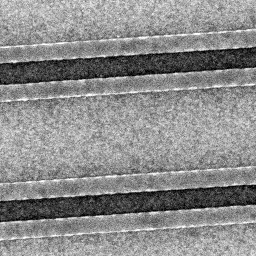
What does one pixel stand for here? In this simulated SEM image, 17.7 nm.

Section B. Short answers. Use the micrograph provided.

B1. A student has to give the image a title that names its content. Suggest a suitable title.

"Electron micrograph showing lines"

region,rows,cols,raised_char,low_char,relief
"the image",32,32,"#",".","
................................
................................
................................
................................
....................############
.......#########################
#####################...........
######..........................
................................
..................##############
...#############################
#################...............
##..............................
................................
................................
................................
................................
................................
................................
................................
................................
......................##########
........########################
#######################.........
##########......................
................................
....................############
.....###########################
#####################...........
######..........................
................................
................................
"